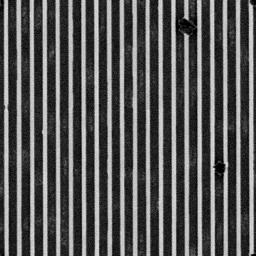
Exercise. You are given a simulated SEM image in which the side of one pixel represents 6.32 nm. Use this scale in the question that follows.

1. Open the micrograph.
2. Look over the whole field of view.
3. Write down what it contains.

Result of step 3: parallel lines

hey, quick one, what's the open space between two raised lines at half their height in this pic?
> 59.3 nanometres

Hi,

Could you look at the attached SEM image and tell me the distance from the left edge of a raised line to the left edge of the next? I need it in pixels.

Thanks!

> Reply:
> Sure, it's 12.9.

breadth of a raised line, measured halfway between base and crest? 23.7 nm